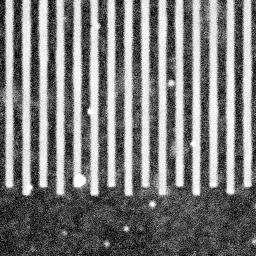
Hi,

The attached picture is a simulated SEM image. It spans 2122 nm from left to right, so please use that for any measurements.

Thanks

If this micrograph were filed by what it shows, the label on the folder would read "parallel lines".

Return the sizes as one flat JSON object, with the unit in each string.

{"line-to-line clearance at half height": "86 nanometres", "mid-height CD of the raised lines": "54.9 nm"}